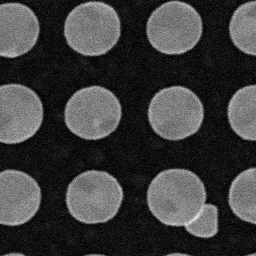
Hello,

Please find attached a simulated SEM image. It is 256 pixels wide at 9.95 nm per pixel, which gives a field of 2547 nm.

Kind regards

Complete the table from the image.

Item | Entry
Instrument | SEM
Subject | raised bodies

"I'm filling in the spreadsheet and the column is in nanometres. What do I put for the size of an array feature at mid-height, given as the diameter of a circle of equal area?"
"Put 538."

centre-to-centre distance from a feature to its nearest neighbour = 82.8 px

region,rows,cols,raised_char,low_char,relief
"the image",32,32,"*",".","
.**.......***........**........*
****.....*****.....*****.....***
*****...*******....******....***
*****...*******...*******....***
*****...*******...*******....***
****.....*****.....*****.....***
***.......***.......***........*
..........*..............*......
................................
................................
................................
****......****......****......**
*****....******....******....***
*****...*******....******....***
*****..********....******....***
*****...*******....******....***
****.....*****......****......**
***.............................
................................
............*...................
................................
**.........**.......****......**
****.....*****...*.******....***
*****...*******....******....***
*****...*******...********...***
*****...*******...********...***
****.....******....********..***
***.......***.......*******....*
.......................****.....
.........................*......
................................
................................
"